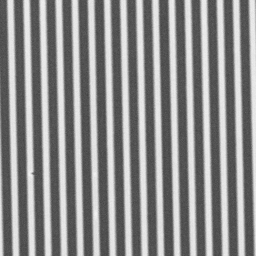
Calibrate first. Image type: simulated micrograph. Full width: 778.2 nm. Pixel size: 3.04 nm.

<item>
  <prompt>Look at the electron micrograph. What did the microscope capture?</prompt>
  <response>parallel lines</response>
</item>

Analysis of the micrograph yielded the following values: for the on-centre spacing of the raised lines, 49 nanometres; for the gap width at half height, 0.0342 micrometres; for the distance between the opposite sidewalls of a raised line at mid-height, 0.0145 µm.